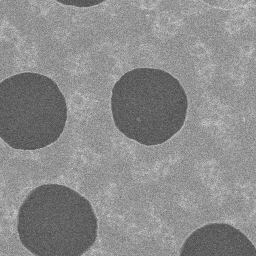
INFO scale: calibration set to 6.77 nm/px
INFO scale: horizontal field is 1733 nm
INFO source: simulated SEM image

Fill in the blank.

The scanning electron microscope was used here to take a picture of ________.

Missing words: holes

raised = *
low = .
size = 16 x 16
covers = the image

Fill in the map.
****************
****************
****************
****************
********..******
....***....*****
....***.....****
....***.....****
....****...*****
****************
****************
****************
**...***********
*.....**********
*.....******...*
**....*****.....